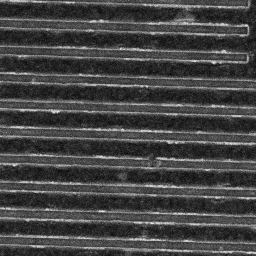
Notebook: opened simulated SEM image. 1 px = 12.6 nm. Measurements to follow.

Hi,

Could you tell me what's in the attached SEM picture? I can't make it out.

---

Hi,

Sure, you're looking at parallel lines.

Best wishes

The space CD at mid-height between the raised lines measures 94.6 nanometres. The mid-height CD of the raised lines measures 246 nm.